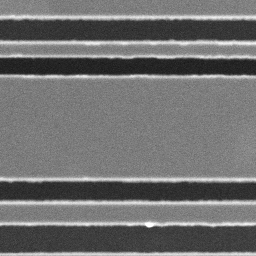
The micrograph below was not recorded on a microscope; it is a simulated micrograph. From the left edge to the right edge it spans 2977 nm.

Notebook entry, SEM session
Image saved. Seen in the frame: lines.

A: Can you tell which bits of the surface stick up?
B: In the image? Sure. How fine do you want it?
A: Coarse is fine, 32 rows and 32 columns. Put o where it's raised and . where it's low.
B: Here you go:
oooooooooooooooooooooooooooooooo
oooooooooooooooooooooooooooooooo
................................
................................
................................
oooooooooooooooooooooooooooooooo
oooooooooooooooooooooooooooooooo
................................
................................
oooooooooooooo.ooooooo..oooooooo
oooooooooooooooooooooooooooooooo
oooooooooooooooooooooooooooooooo
oooooooooooooooooooooooooooooooo
oooooooooooooooooooooooooooooooo
oooooooooooooooooooooooooooooooo
oooooooooooooooooooooooooooooooo
oooooooooooooooooooooooooooooooo
oooooooooooooooooooooooooooooooo
oooooooooooooooooooooooooooooooo
oooooooooooooooooooooooooooooooo
oooooooooooooooooooooooooooooooo
oooooooooooooooooooooooooooooooo
oooooooooooooooooooooooooooooooo
................................
................................
oooooooooooooooooooooooooooooooo
oooooooooooooooooooooooooooooooo
oooooooooooooooooooooooooooooooo
................................
................................
................................
................................